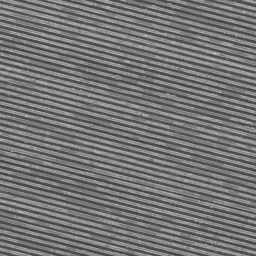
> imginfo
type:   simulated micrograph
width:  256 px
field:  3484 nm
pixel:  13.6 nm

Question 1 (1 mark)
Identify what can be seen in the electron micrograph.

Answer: parallel lines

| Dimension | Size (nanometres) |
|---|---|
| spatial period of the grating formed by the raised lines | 80.6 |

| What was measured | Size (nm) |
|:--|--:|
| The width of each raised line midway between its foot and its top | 39.6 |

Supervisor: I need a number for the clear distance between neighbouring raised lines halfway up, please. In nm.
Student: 39.6